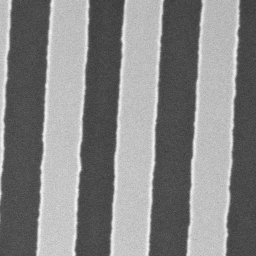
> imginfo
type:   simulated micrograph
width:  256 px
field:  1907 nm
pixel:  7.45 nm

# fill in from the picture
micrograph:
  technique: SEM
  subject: lines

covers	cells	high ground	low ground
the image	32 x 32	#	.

#.....#####.....####.....#####..
#.....#####.....####.....#####..
#.....#####....#####.....#####..
#.....#####....#####.....#####..
#.....#####....#####.....#####..
#.....#####....#####.....#####..
#.....#####....#####.....#####..
#.....#####....#####.....#####..
#.....#####....#####.....####...
#.....#####....#####.....####...
#.....#####....#####.....####...
#.....#####....#####.....####...
#.....####.....#####.....####...
#.....####.....#####.....####...
......####.....#####....#####...
......####.....####.....#####...
.....#####.....####.....#####...
.....#####.....####.....#####...
......####.....####.....#####...
.....#####....#####.....#####...
.....#####....#####.....#####...
.....#####....#####.....#####...
.....#####....#####.....#####...
.....#####....#####.....#####...
.....#####....#####.....#####...
.....#####....#####.....#####...
.....#####....#####.....#####...
.....#####....#####.....####....
.....####.....#####.....####....
.....####.....#####....#####....
.....####.....#####....#####....
.....####.....#####....#####....